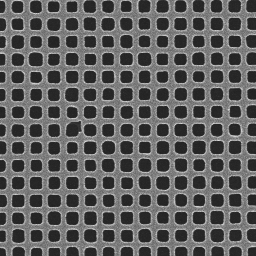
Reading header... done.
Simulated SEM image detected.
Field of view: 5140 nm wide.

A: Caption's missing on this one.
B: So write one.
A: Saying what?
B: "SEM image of a regular array of holes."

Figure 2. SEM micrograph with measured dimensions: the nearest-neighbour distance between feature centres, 17.5 pixels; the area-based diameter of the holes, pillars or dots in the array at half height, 0.269 um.